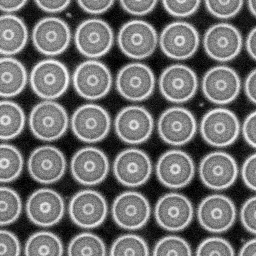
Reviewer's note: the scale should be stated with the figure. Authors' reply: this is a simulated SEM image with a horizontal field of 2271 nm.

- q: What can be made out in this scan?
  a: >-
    an array of small figures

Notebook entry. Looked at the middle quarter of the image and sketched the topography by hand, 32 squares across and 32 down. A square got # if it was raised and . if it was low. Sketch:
#####....########..#############
####......#####......#####.....#
.##........###.......####.......
.##........###........###.......
.##........###........##........
###........###........###.......
####......####.......####.......
#####....######......####.......
#################..########...##
################################
################################
####.....#######...#########.###
###.......####......######.....#
###........###.......####.......
##.........###.......###........
##.........##.........##........
###........###.......###........
####......####.......####.......
#####....######.....#####......#
###########################..###
################################
######.#########################
####.....######....#######...###
###.......####......#####......#
##........###........###.......#
##...##...###........###........
##....#...###........###........
###.......###........###........
####.....#####......####.......#
#####...#######....######.....##
################################
################################